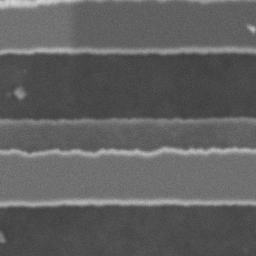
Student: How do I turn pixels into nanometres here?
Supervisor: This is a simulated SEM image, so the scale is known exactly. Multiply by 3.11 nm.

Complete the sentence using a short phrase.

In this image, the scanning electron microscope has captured lines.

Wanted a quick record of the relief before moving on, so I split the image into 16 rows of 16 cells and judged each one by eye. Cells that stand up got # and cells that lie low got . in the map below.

################
################
################
................
................
................
................
##...###########
################
################
################
################
################
................
................
................